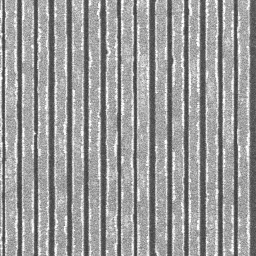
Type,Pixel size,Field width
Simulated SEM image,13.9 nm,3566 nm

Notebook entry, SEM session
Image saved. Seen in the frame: parallel lines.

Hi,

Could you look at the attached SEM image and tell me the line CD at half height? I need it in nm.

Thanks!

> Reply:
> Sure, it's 172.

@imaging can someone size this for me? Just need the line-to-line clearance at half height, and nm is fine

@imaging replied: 66.2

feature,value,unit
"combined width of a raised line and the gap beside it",231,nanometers